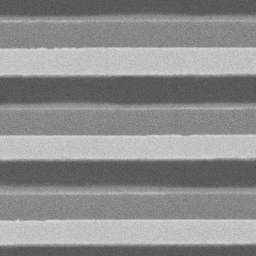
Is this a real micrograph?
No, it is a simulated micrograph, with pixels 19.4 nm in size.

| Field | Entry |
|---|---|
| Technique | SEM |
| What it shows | lines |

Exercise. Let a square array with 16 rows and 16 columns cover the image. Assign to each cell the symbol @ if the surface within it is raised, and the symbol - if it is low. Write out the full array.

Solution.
----------------
@@@@@@@@@@@@@@@@
@@@@@@@@@@@@@@@@
@@@@@@@@@@@@@@@@
@@@@@@@@@@@@@@@@
----------------
----------------
@@@@@@@@@@@@@@@@
@@@@@@@@@@@@@@@@
@@@@@@@@@@@@@@@@
----------------
----------------
@@@@@@@@@@@@@@@@
@@@@@@@@@@@@@@@@
@@@@@@@@@@@@@@@@
----------------